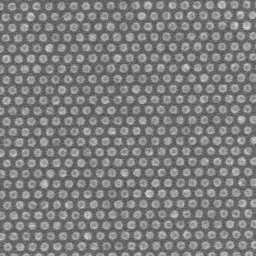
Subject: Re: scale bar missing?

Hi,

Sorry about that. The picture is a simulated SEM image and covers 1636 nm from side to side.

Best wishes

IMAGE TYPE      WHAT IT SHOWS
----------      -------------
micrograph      a regular array of raised bodies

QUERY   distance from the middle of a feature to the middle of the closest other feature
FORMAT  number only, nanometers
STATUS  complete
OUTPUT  75.6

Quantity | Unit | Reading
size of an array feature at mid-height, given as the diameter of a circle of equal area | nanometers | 43.3